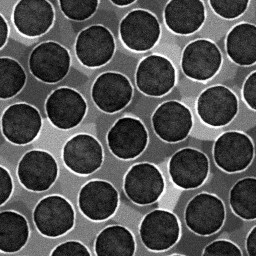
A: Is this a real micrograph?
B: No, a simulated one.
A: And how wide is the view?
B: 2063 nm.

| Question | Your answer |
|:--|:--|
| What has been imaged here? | a regular array of holes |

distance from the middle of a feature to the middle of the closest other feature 382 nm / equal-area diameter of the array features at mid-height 328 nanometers